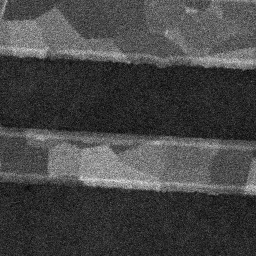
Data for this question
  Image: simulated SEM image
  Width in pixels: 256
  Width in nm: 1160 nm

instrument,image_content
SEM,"one or a few lines or trenches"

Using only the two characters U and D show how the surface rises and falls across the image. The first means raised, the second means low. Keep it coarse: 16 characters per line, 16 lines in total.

UUUUUUUUUUUUUUUU
UUUUUUUUUUUUUUUU
UUUUUUUUUUUUUUUU
DDDDDDDDDUUUUUUU
DDDDDDDDDDDDDDDD
DDDDDDDDDDDDDDDD
DDDDDDDDDDDDDDDD
DDDDDDDDDDDDDDDD
UUDDDDDDDDDDDDDD
UUUUUUUUUUUUUUUU
UUUUUUUUUUUUUUUU
DDDDDDDDDDDUUUUU
DDDDDDDDDDDDDDDD
DDDDDDDDDDDDDDDD
DDDDDDDDDDDDDDDD
DDDDDDDDDDDDDDDD